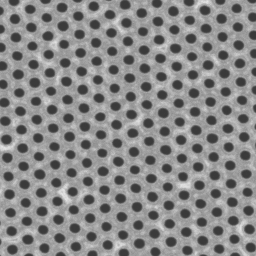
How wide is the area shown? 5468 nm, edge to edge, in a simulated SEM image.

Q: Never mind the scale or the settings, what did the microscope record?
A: a regular array of holes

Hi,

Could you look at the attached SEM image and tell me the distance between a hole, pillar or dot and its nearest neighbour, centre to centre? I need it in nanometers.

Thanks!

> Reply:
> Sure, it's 386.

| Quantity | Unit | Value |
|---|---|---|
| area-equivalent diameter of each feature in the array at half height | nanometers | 212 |